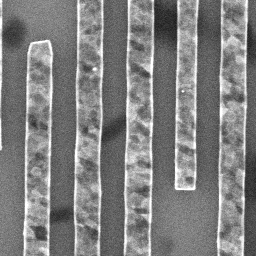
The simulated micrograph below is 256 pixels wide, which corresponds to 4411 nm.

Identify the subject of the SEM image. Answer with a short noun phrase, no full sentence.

wiring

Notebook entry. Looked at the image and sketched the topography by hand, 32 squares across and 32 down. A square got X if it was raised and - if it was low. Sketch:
----------XXX---XXX---XXX---XXX-
----------XXX---XXX---XXX---XXX-
----------XXX---XXX---XXX---XXX-
----------XXX---XXX---XXX---XXX-
----------XXX---XXX---XXX---XXX-
----XX----XXX---XXX---XXX---XXX-
----XX----XXX---XXX---XXX---XXX-
----XX----XXX---XXX---XXX---XXX-
---XXX----XXX---XXX---XXX---XXX-
---XXX----XXX---XXX---XX----XXX-
---XXX----XXX---XXX---XX----XXX-
---XXX----XXX---XXX---XX----XXX-
---XXX----XXX---XXX---XX----XXX-
---XXX----XXX---XXX---XX----XXX-
---XXX----XXX---XXX---XX----XXX-
---XXX----XXX---XXX---XX----XXX-
---XXX----XXX---XXX---XX----XXX-
---XXX----XX----XXX---XX----XXX-
---XXX---XXX----XXX---XX----XXX-
---XXX---XXX----XXX---XX---XXXX-
---XXX---XXX----XXX---XX---XXXX-
---XXX---XXX----XXX---XX---XXXX-
---XXX---XXX----XXX---XX---XXXX-
---XXX---XXXX---XXX---XX---XXX--
---XXX---XXXX---XXX---------XX--
---XXX---XXX----XXX---------XX--
---XXX---XXX----XXX--------XXX--
---XXX---XXX----XXX--------XXX--
---XXX---XXX----XXX--------XXX--
---XXX---XXX----XXX--------XXX--
---XXX---XXX----XXX--------XXX--
---XXX---XXX----XXX--------XXX--